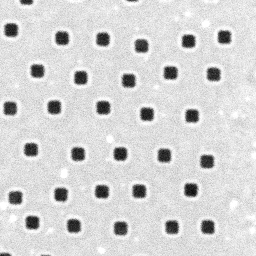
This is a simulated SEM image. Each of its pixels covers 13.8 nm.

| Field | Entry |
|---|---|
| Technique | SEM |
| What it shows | a regular array of holes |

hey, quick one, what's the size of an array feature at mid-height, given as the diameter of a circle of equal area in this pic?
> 0.23 microns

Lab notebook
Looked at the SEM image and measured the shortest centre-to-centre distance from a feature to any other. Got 0.519 µm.